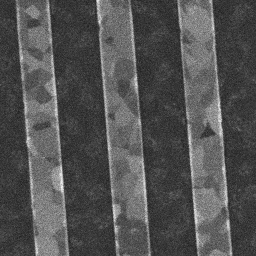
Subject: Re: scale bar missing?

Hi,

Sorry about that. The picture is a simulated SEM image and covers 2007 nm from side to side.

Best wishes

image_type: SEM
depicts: one or a few lines or trenches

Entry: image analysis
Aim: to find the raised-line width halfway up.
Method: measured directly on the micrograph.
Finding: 257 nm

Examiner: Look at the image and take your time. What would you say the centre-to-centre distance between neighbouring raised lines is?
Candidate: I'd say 635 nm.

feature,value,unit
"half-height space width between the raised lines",0.377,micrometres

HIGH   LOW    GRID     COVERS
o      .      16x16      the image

.oo...oo...oo...
.oo...oo...oo...
.oo...oo...oo...
.oo...oo...oo...
.oo...oo...ooo..
.oo...ooo...oo..
..oo...oo...oo..
..oo...oo...oo..
..oo...oo...oo..
..oo...oo...oo..
..oo...oo...oo..
..oo...oo...oo..
..oo...oo...oo..
..oo...oo...oo..
..oo...oo...oo..
..oo...oo...oo..